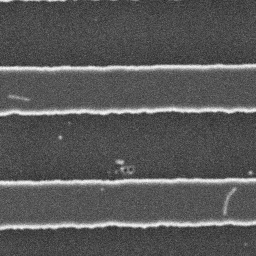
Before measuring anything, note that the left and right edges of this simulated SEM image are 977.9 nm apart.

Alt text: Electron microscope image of lines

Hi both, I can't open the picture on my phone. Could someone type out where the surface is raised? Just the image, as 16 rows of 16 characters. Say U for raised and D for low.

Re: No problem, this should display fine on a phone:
DDDDDDDDDDDDDDDD
DDDDDDDDDDDDDDDD
DDDDDDDDDDDDDDDD
DDDDDDDDDDDDDDDD
UUUUUUUUUUUUUUUU
UUUUUUUUUUUUUUUU
UUUUUUUUUUUUUUUU
DDDDDDDDDDDDDDDD
DDDDDDDDDDDDDDDD
DDDDDDDDDDDDDDDD
DDDDDDDDDDDDDDDD
UUUUUUUUUUUUUUUU
UUUUUUUUUUUUUUUU
UUUUUUUUUUUUUUUU
DDDDDDDDDDDDDDDD
DDDDDDDDDDDDDDDD